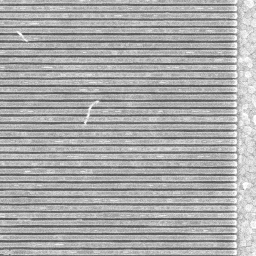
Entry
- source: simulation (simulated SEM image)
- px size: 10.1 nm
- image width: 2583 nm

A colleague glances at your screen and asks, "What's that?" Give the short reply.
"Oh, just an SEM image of parallel lines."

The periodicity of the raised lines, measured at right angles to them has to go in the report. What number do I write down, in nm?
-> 74.5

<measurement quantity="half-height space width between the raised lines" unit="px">2.76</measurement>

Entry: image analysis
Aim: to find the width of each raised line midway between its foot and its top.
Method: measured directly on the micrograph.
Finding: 47.9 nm